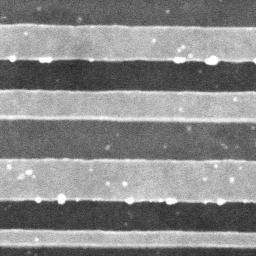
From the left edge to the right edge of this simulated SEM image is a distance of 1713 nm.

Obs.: lines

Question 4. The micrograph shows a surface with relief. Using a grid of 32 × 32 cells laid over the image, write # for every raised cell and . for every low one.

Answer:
................................
................................
................................
#########################.......
################################
################################
################################
.#..###....#.##......###########
................................
................................
................................
###########.########............
################################
################################
################################
................................
................................
................................
................................
................................
################################
################################
################################
################################
################################
................................
................................
................................
................................
################################
################################
................................